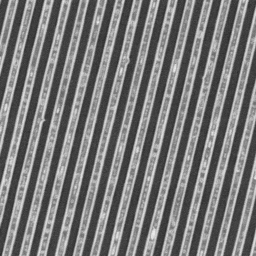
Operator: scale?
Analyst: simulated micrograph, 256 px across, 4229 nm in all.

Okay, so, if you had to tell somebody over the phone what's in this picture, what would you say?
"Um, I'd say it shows parallel lines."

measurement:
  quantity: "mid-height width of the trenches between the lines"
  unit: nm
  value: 159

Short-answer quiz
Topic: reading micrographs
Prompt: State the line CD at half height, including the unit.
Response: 129 nm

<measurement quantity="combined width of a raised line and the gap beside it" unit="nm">285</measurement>